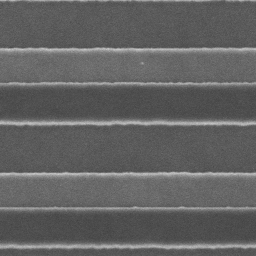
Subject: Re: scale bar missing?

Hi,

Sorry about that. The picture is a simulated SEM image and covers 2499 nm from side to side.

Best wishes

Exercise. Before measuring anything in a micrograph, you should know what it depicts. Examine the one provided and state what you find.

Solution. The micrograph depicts lines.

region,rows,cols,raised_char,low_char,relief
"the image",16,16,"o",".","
................
................
................
oooooooooooooooo
oooooooooooooooo
oooooooooooooooo
oooooooooooooooo
oooooooooooooooo
................
................
................
oooooooooooooooo
oooooooooooooooo
oooooooooooooooo
oooooooooooooooo
................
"